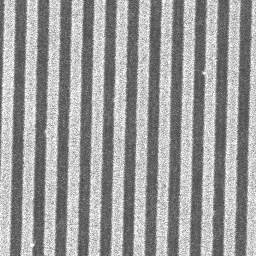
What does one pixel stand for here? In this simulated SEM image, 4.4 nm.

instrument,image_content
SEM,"parallel lines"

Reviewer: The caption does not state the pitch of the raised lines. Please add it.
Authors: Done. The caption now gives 98.9 nm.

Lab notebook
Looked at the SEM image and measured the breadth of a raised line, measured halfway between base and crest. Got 53.3 nanometers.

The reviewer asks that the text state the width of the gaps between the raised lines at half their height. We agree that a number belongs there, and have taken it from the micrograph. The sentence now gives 45.6 nm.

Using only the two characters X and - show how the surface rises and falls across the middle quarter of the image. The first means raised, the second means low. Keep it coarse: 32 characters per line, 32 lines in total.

--XX---XXX---XXX--XXX---XXX---XX
--XX---XXX---XXX--XXX---XXX---XX
--XX---XXX---XXX--XXX---XXX---XX
-XXXX--XXX---XXX--XXX---XXX---XX
-XXX---XXX---XXX--XXX---XXX---XX
-XXX---XXX---XX---XXX---XXX---XX
-XXX---XXX---XX---XXX---XXX---XX
-XXX---XXX---XX---XXX---XXX---XX
-XXX---XXX--XXX---XXX---XXX--XXX
-XXX---XXX--XXXX--XXX---XXX--XXX
-XXX---XXX---XXX--XXX---XXX--XXX
-XXX---XXX--XXXX--XXX---XXX--XXX
-XXX---XXX--XXX---XXX---XXX--XXX
-XXX---XXX--XXX---XXX---XXX--XXX
-XXX---XXX--XXX---XXX---XXX--XXX
-XXX---XXX--XXX---XXX---XXX--XXX
-XXX---XXX--XXX---XXX---XX---XXX
-XXX---XXX--XXX---XXX---XX---XXX
-XXX---XXX--XXX---XXX---XXX--XXX
-XXX---XXX--XXX---XXX---XXX--XXX
-XXX---XXX--XXX---XXX---XXX--XXX
-XXX---XXX--XXX---XXX---XX---XXX
-XXX---XXX--XXX---XXX---XXX--XXX
-XXX---XXX--XXX---XXX---XXX--XXX
-XXX---XXX--XXX---XXX---XXX--XXX
-XXX---XXX--XXX---XXX--XXX---XXX
-XXX---XXX--XXX---XXX--XXX---XXX
-XXX---XXX--XXX---XXX--XXX---XXX
-XXX---XXX--XXX---XXX--XXX---XXX
-XXX---XX---XXX---XXX--XXX---XXX
-XXX---XX---XXX---XXX--XXX---XXX
-XXX--XXX---XXX---XXX--XXX---XXX